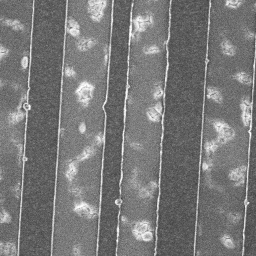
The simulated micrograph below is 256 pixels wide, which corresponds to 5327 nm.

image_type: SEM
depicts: one or a few lines or trenches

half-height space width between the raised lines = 45.7 pixels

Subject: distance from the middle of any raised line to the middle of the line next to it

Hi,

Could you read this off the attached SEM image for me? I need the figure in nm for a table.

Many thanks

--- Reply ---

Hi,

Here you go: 1450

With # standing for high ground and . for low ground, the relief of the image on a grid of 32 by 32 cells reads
....####......###....#####......
....####......##.....#####......
....####......##.....#####......
....####......##.....#####......
....####......##.....#####......
....####......##.....#####......
....####......##.....#####......
....####......##.....#####......
....####......##.....#####......
....####......##.....#####......
....####......##.....#####......
....####.....###.....#####......
...#####.....###....######......
...#####.....###....#####.......
...####......###....#####......#
...####......###....#####......#
...####......###....#####......#
...####......##.....#####......#
...####......##.....#####......#
...####......##.....#####......#
...####......##.....#####......#
...####......##.....#####......#
...####......##.....#####......#
...####......##.....#####......#
...####......##.....#####......#
...####......##.....#####......#
...####......##.....#####......#
...####.....###.....#####......#
..#####.....###.....#####......#
..#####.....###....#####......##
..####......###....#####......##
..####......###....#####......##